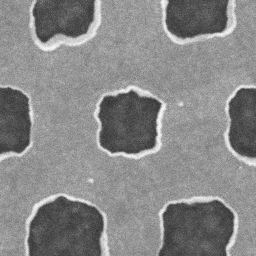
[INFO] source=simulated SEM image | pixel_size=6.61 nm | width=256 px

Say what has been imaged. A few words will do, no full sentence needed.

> holes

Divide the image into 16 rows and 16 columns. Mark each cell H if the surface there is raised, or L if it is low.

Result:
HHLLLLHHHHLLLLHH
HHLLLLHHHHLLLLHH
HHHLLHHHHHHLHHHH
HHHHHHHHHHHHHHHH
HHHHHHHHHHHHHHHH
HHHHHHHHHHHHHHHL
LLHHHHLLLLHHHHLL
LLHHHHLLLLHHHHLL
LLHHHHLLLLHHHHLL
LHHHHHHLLHHHHHHL
HHHHHHHHHHHHHHHH
HHHHHHHHHHHHHHHH
HHHLLHHHHHHHHHHH
HHLLLLHHHHLLLLLH
HHLLLLHHHHLLLLLH
HHLLLLLHHHLLLLHH